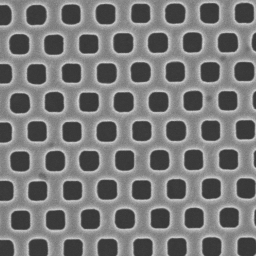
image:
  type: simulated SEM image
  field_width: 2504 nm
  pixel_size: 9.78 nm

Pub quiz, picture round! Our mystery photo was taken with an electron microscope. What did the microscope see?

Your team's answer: a regular array of holes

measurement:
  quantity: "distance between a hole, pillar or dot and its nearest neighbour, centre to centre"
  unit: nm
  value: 330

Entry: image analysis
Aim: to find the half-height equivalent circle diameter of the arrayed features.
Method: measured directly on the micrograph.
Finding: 0.21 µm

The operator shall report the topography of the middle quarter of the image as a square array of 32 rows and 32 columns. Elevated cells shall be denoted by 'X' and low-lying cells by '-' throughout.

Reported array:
----XXXX-----XXXX----XXXX-----XX
----XXXX-----XXXX-----XXX-----XX
----XXXX-----XXXX-----XXX-----XX
----XXXX-----XXXX-----XXXX----XX
----XXXXX----XXXXX--XXXXXXX--XXX
XXXXXXXXXXXXXXXXXXXXXXXXXXXXXXXX
XXXXXXXXXXXXXXXXXXXXXXXXXXXXXXXX
XXXX----XXXXX----XXXXX----XXXX--
XXXX-----XXX------XXX-----XXXX--
XXXX-----XXX------XXX-----XXXX--
XXXX-----XXX------XXX-----XXXX--
XXXX----XXXXX----XXXXX----XXXX--
XXXXXXXXXXXXXXXXXXXXXXXXXXXXXXXX
XXXXXXXXXXXXXXXXXXXXXXXXXXXXXXXX
X--XXXXXX----XXXXX---XXXXX----XX
----XXXX-----XXXX-----XXXX----XX
-----XXX-----XXXX-----XXX------X
-----XXX-----XXXX-----XXX------X
----XXXX-----XXXX-----XXXX----XX
X--XXXXXX---XXXXXXXXXXXXXXXXXXXX
XXXXXXXXXXXXXXXXXXXXXXXXXXXXXXXX
XXXXXXXXXXXXXX--XXXXXXX--XXXXXX-
XXXX-----XXXX----XXXXX----XXXX--
XXXX-----XXXX-----XXX-----XXXX--
-XXX-----XXXX-----XXX-----XXXX--
XXXX-----XXXX----XXXX-----XXXX--
XXXXX---XXXXXX---XXXXXX--XXXXXX-
XXXXXXXXXXXXXXXXXXXXXXXXXXXXXXXX
XXXXXXXXXXXXXXXXXXXXXXXXXXXXXXXX
----XXXXX----XXXX----XXXXX----XX
-----XXX-----XXXX-----XXXX-----X
-----XXX-----XXXX-----XXXX-----X